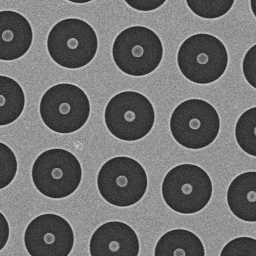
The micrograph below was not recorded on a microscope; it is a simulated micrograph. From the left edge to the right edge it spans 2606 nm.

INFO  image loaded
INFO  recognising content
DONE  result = an array of small figures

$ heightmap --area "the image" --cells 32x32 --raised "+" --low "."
++++++++++++++++....+++......++.
..++++++++++++++++++++++....++++
...+++++..++++++++++++++++++++++
....+++.....++++..++++++++++++++
....++......+++.....++++...+++++
....++......++......+++.....++++
...+++......++......++......+++.
.++++++....+++......++.......+..
++++++++..+++++.....++......++..
.++++++++++++++++++++++.....+++.
..+++++..++++++++++++++++.+++++.
...+++....+++++..+++++++++++++++
...++......+++.....++++..+++++++
...++......++......+++.....++++.
..+++......++......++......+++..
.+++++.....++......++......+++..
+++++++..+++++.....++......++...
+++++++++++++++..+++++.....+++..
.++++++++++++++++++++++..+++++..
..+++....+++++++++++++++++++++++
..++......+++....++++++.++++++++
..++......++......+++.....+++++.
..++......++......++......+++...
+++++.....++......++.......++...
++++++..+++++.....++......++....
++++++++++++++...++++.....++....
++++++++++++++++++++++...++++...
.+++....++++++++++++++++++++++..
.++......+++....++++++++++++++++
.++......++......+++.....+++++++
.++......++......+++.....+++....
++++.....++......++.......++....